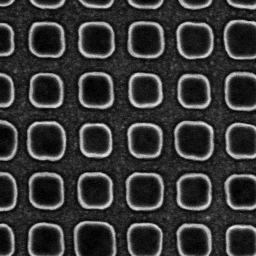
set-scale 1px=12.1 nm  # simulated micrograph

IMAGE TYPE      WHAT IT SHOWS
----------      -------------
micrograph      a regular array of raised bodies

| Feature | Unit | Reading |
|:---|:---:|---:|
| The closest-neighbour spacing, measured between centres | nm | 594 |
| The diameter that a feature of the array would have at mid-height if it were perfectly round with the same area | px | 36.2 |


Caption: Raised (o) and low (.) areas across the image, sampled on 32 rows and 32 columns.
o...oooo...ooo..oooo...ooo...ooo
................................
................................
o...oooo..oooo..oooo..oooo..oooo
oo..oooo..oooo..oooo..ooooo.oooo
oo..oooo..oooo..oooo..ooooo.oooo
o...oooo..oooo..oooo...ooo..oooo
................................
................................
o...ooo...ooo....oo....o.....ooo
oo..oooo..oooo..oooo..oooo..oooo
oo..oooo..oooo..oooo..oooo..oooo
oo..oooo..oooo..oooo...ooo..oooo
.............................ooo
................................
o...ooo................oo.......
oo..oooo..oooo..oooo..ooooo.oooo
oo..oooo..oooo..oooo..ooooo.oooo
oo..oooo..oooo..oooo..ooooo.oooo
o...oooo....o....oo....ooo...ooo
................................
................................
oo..oooo..oooo..oooo...ooo...ooo
oo..oooo..oooo..oooo..oooo..oooo
oo..oooo..oooo..oooo..oooo..oooo
oo..oooo..oooo..oooo...ooo...ooo
................................
................................
o...ooo...oooo..oooo...ooo...ooo
oo..oooo.ooooo..oooo..oooo..oooo
oo..oooo.ooooo..oooo..oooo..oooo
oo..oooo..oooo..oooo...ooo..oooo